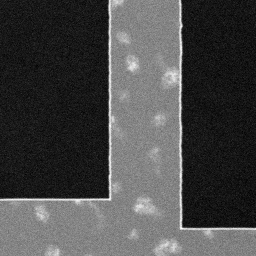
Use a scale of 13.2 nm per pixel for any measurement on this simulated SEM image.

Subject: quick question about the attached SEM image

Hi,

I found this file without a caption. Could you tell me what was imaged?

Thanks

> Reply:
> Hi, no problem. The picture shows one or a few lines or trenches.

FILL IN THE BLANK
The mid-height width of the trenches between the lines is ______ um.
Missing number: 0.93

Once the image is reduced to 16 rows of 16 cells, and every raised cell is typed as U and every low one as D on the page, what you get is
UUUUUUUDDDDUUUUU
UUUUUUUDDDDUUUUU
UUUUUUUDDDDUUUUU
UUUUUUUDDDDUUUUU
UUUUUUUDDDDUUUUU
UUUUUUUDDDDUUUUU
UUUUUUUDDDDUUUUU
UUUUUUUDDDDUUUUU
UUUUUUUDDDDUUUUU
UUUUUUUDDDDUUUUU
UUUUUUUDDDDUUUUU
UUUUUUUDDDDUUUUU
DDDDDDDDDDDUUUUU
DDDDDDDDDDDUUUUU
DDDDDDDDDDDDDDDD
DDDDDDDDDDDDDDDD